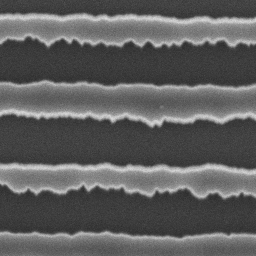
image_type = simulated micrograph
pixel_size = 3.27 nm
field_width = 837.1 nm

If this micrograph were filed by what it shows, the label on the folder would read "lines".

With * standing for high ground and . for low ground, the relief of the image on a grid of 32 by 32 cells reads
................................
................................
**********************..**......
********************************
***.****************************
..............*..*.*............
................................
................................
................................
................................
**..****..*.....................
********************************
********************************
********************************
............***.*************...
................................
................................
................................
................................
................................
................................
********************************
********************************
.********......*****************
.........................*......
................................
................................
................................
................................
****************.........*******
********************************
********************************